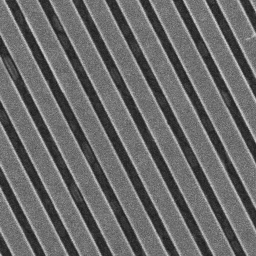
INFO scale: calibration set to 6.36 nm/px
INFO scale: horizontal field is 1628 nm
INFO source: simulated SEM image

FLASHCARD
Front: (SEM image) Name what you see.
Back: parallel lines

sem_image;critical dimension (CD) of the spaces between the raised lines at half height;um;0.0652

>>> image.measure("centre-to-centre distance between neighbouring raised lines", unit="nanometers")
189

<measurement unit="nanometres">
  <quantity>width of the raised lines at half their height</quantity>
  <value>125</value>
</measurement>